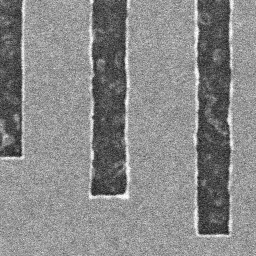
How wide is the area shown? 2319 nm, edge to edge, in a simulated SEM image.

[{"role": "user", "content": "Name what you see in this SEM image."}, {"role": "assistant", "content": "one or a few lines or trenches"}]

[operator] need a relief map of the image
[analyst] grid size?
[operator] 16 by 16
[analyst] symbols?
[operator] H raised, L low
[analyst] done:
LHHHHHLLHHHHLLHH
LHHHHHLLHHHHLLHH
LHHHHHLLHHHHLLHH
LHHHHHLLHHHHLLHH
LHHHHHLLHHHHLLHH
LHHHHHLLHHHHLLHH
LHHHHHLLHHHHLLHH
LHHHHHLLHHHHLLHH
LHHHHHLLHHHHLLHH
LHHHHHLLHHHHLLHH
HHHHHHLLHHHHLLHH
HHHHHHLLHHHHLLHH
HHHHHHHHHHHHLLHH
HHHHHHHHHHHHLLHH
HHHHHHHHHHHHHLHH
HHHHHHHHHHHHHHHH